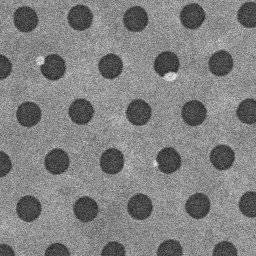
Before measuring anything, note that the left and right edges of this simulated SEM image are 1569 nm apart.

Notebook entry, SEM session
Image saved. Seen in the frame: a regular array of holes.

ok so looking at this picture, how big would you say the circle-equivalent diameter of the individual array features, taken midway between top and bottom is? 162 nm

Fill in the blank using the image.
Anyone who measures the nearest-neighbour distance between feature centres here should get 330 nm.